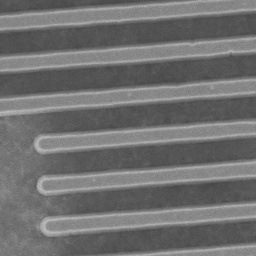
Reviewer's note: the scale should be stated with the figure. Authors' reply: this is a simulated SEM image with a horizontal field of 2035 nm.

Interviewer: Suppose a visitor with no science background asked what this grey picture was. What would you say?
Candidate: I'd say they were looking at parallel lines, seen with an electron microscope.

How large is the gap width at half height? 0.195 microns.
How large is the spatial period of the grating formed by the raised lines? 0.329 µm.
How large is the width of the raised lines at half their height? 135 nm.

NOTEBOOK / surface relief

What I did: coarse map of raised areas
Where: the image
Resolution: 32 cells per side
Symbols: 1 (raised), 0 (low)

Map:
00000000000000000111111111111111
00011111111111111111111111111110
11111111111111111111000000000000
11111000000000000000000000000000
00000000000000000000000000000000
00000000000000000000111111111111
00000001111111111111111111111111
11111111111111111111100000000000
11111111000000000000000000000000
00000000000000000000000000000000
00000000000000000000000111111111
00000000001111111111111111111111
11111111111111111111111000000000
11111111111000000000000000000000
00000000000000000000000000000000
00000000000000000000000011111111
00000000000011111111111111111111
00000111111111111111111111000000
00000111111110000000000000000000
00000000000000000000000000000000
00000000000000000000000000011111
00000000000000111111111111111111
00000111111111111111111111110000
00000111111111100000000000000000
00000000000000000000000000000000
00000000000000000000000000001111
00000000000000000111111111111111
00000011111111111111111111111100
00000111111111111000000000000000
00000000000000000000000000000000
00000000000000000000000000000000
00000000000000000001111111111111